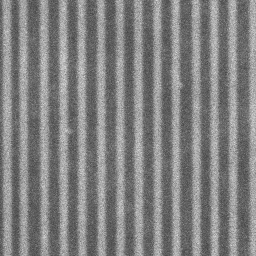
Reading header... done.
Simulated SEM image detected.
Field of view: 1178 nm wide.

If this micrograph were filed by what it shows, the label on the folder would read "parallel lines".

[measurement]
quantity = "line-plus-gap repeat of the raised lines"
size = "86.4 nanometres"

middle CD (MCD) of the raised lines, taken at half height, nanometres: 31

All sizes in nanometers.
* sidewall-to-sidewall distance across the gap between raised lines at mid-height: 57.5